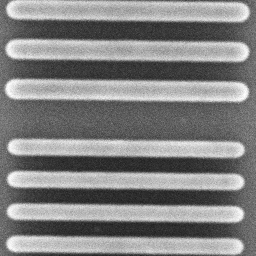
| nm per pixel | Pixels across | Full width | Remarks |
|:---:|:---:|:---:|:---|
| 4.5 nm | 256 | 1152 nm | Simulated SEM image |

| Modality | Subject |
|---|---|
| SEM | groups of lines, slits or small figures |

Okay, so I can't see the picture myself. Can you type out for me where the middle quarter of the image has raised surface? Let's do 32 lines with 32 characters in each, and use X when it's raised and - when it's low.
--------------------------------
--------------------------------
--------------------------------
--------------------------------
XXXXXXXXXXXXXXXXXXXXXXXXX-------
XXXXXXXXXXXXXXXXXXXXXXXXXXXXXXXX
XXXXXXXXXXXXXXXXXXXXXXXXXXXXXXXX
XXXXXXXXXXXXXXXXXXXXXXXXXXXXXXXX
XXXXXXXXXXXXXXXXXXXXXXXXXXXXXXXX
--------------------------------
--------------------------------
--------------------------------
--------------------------------
--------------------------------
--------------------------------
--------------------------------
--------------------------------
--------------------------------
--------------------------------
XXXXXXXXXXXXXXXXXXXXXXXXXXXXXXX-
XXXXXXXXXXXXXXXXXXXXXXXXXXXXXXXX
XXXXXXXXXXXXXXXXXXXXXXXXXXXXXXXX
XXXXXXXXXXXXXXXXXXXXXXXXXXXXXXXX
--------------------------------
--------------------------------
--------------------------------
--------------------------------
XXXXXXXXXXXXXXXXXXXXX-----------
XXXXXXXXXXXXXXXXXXXXXXXXXXXXXXXX
XXXXXXXXXXXXXXXXXXXXXXXXXXXXXXXX
XXXXXXXXXXXXXXXXXXXXXXXXXXXXXXXX
--------------------------------